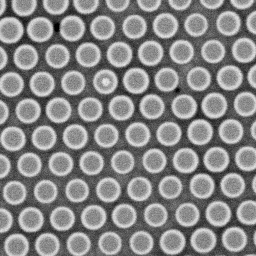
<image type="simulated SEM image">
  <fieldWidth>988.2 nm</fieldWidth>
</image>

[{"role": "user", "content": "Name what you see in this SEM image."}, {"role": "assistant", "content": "an array of small figures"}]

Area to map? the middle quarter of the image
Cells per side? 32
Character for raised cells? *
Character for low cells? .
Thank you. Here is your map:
.....**......**.................
................***.....***.....
****....*****..******..*****...*
*****...*****..******..*****...*
*****...*****..******..*****...*
*****...*****..******..*****...*
*****...*****...****....***.....
.*..............................
.............***....****....****
*...*****...*****..******..*****
**..*****..******..******..*****
**..*****..******..******..*****
**..*****...*****...****....****
*....***.....***.....**......*..
................................
..**.....***....****....****...*
*****...*****...*****...*****..*
******..*****...*****..******..*
******..*****...*****..******..*
*****...*****...*****...****....
.****.....**......*.............
......................**.....***
*....****....****...*****...****
**..*****...*****...*****..*****
**..******..*****...*****..*****
**..******..*****...*****...****
**...****....****....***.....***
*.....**........................
...................*.....***....
.****....****....****...*****...
.*****..******..******..*****...
.*****..******..******..*****...